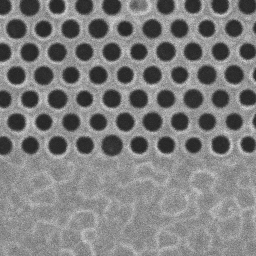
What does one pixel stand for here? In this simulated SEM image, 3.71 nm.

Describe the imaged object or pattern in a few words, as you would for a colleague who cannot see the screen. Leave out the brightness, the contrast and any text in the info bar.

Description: a regular array of holes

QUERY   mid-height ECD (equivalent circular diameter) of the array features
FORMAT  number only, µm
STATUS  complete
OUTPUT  0.0688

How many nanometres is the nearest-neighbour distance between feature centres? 98.9